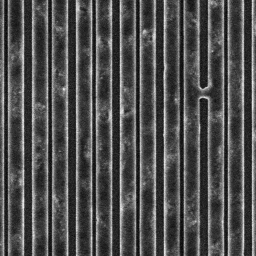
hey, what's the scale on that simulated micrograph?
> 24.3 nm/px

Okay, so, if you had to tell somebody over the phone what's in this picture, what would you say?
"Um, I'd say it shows parallel lines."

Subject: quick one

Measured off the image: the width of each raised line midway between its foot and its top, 0.362 µm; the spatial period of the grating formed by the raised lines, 22 px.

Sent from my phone